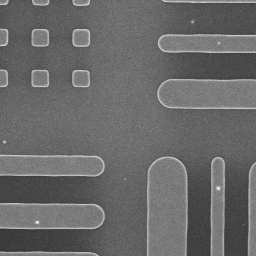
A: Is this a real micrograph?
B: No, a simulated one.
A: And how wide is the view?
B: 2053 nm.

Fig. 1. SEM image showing groups of lines, slits or small figures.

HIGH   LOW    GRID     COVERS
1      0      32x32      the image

10001100011000000000000000000000
00000000000000000000000000000000
00000000000000000000000000000000
00000000000000000000000000000000
10001100011000000000111111111111
10001100011000000000111111111111
00000000000000000000011001111111
00000000000000000000000000000000
00000000000000000000000000000000
10001100011000000000000000000000
10001100011000000000111111111111
00000000000000000000111111111111
00000000000000000000111111111111
00000000000000000000011111111111
00000000000000000000000000000000
00000000000000000000000000000000
00000000000000000000000000000000
00000000000000000000000000000000
00000000000000000000000000000000
11100000000000000000000000000000
11111111111110000001111000110000
11111111111110000001111000110001
00000000000000000001111000110001
00000000000000000011111000110001
00000000000000000011111000110001
11100000000000000011111000110001
11111111111110000001111000110001
11111111111110000011111000110001
00011110111100000011111000110001
00000000000000000011111000110001
00000000000000000011111000110001
10001100000000000011111000110001